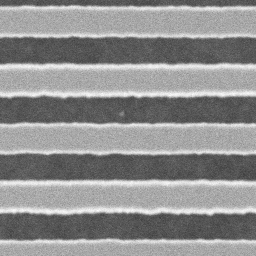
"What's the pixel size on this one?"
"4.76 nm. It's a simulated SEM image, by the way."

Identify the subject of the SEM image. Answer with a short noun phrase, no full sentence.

lines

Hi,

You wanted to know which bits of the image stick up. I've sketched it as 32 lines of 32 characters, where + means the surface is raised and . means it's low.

................................
++++++++++++++++++++++++++++++++
++++++++++++++++++++++++++++++++
++++++++++++++++++++++++++++++++
+++.+++++.++++++.+++++++++++++.+
................................
................................
................................
++++++++++++++++++++++++++++++++
++++++++++++++++++++++++++++++++
++++++++++++++++++++++++++++++++
++++++++++++++++++++++++++++++++
................................
................................
................................
...++..+.++...+..........+......
++++++++++++++++++++++++++++++++
++++++++++++++++++++++++++++++++
++++++++++++++++++++++++++++++++
................................
................................
................................
.........................+......
++++++++++++++++++++++++++++++++
++++++++++++++++++++++++++++++++
++++++++++++++++++++++++++++++++
++.++++++++++++++++++++++++++++.
................................
................................
................................
++++++++++++++++++++++++++++++++
++++++++++++++++++++++++++++++++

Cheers